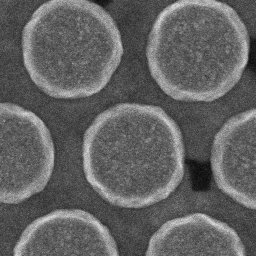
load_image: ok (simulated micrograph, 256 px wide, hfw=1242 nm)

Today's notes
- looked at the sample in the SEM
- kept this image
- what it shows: raised bodies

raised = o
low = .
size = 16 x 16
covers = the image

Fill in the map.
...ooo.....ooo..
..ooooo...ooooo.
..ooooo...ooooo.
..ooooo..oooooo.
..ooooo...ooooo.
...ooo....oooo..
................
oo....oooo.....o
ooo...ooooo...oo
ooo..oooooo...oo
ooo..oooooo...oo
oo....ooooo...oo
.......oo......o
...oo...........
..ooooo...oooo..
.oooooo..oooooo.